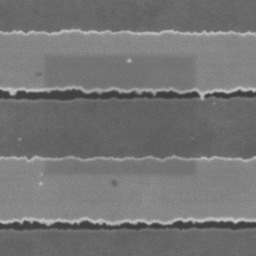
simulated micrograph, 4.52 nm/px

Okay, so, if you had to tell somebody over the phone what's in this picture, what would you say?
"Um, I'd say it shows lines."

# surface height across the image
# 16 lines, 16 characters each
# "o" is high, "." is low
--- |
................
................
oooooooooooooooo
oooooooooooooooo
oooooooooooooooo
oooooooooooooooo
................
................
................
................
oooooooooooooooo
oooooooooooooooo
oooooooooooooooo
oooooooooooooooo
................
................